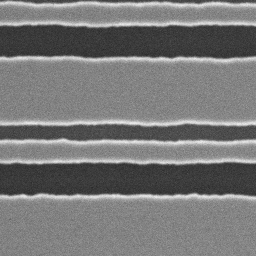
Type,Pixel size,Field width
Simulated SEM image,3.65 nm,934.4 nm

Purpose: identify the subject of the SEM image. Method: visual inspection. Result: lines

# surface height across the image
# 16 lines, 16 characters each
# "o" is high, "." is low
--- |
oooooooooooooooo
oooooooooooooooo
................
................
oooooooooooooooo
oooooooooooooooo
oooooooooooooooo
oooooooooooooooo
oooooooooooooooo
oooooooooooooooo
................
................
oooooooooooooooo
oooooooooooooooo
oooooooooooooooo
oooooooooooooooo